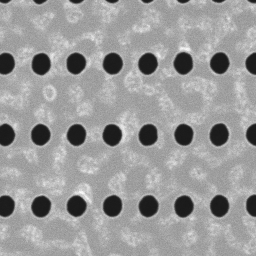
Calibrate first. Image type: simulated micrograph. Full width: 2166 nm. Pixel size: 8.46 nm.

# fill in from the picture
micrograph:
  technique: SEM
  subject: a regular array of holes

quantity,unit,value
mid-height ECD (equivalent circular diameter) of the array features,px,20.4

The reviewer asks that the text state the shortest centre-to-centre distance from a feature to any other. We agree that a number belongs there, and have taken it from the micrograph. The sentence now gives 0.3 um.